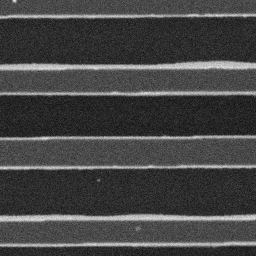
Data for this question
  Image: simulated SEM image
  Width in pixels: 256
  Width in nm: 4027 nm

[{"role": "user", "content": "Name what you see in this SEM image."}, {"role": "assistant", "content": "lines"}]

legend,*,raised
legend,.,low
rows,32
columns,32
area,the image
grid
********************************
********************************
................................
................................
................................
................................
................................
................................
...*****************************
********************************
********************************
********************************
................................
................................
................................
................................
................................
********************************
********************************
********************************
********************************
................................
................................
................................
................................
................................
................................
********************************
********************************
********************************
************....................
................................